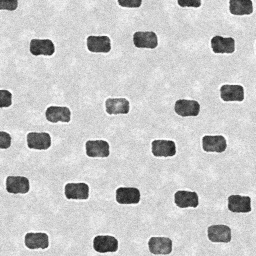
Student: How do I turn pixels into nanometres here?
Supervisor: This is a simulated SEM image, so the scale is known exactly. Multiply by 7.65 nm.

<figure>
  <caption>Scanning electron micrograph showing a regular array of holes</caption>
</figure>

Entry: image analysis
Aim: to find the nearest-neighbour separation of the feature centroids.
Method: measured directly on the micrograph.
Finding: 361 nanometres